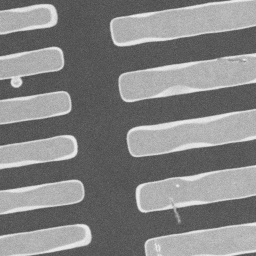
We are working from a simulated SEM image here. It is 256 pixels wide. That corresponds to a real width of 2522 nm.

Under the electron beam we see groups of lines, slits or small figures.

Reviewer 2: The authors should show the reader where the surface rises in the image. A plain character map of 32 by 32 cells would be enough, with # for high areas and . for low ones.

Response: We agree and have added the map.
..........................######
#######............#############
#######.......##################
####..........################..
..............##########........
...............#................
...#####........................
########..................######
########............############
###............#################
...............###############..
.......#.......######...........
#########.......#...............
#########.......................
#######.....................####
......................##########
................################
.....####.......###############.
#########.......#######.........
#########.......................
##..............................
...........................#####
....................############
....######.......###############
##########.......##############.
#########........######.........
#...............................
................................
......#####................#####
###########.........############
##########........##############
######............#############.